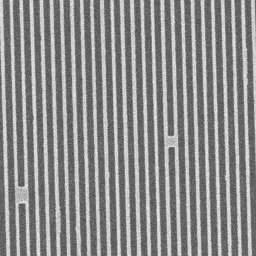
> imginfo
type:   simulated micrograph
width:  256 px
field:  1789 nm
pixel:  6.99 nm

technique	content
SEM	parallel lines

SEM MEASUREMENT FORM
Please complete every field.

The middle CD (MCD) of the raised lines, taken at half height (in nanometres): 20.1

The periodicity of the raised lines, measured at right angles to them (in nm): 70.4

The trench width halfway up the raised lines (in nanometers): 52.4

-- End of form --